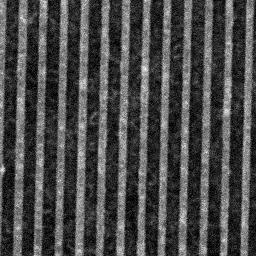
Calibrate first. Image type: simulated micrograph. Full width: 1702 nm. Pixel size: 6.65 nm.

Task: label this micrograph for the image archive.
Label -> parallel lines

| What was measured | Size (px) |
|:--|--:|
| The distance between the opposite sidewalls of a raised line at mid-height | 7.01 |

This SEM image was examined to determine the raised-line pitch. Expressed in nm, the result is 137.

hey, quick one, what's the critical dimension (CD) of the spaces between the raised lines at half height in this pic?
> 92.3 nm